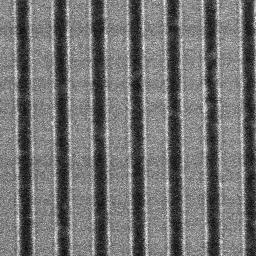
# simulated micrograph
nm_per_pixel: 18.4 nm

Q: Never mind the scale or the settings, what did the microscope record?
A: parallel lines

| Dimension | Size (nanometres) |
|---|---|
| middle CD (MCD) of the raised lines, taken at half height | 302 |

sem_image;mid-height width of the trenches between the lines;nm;385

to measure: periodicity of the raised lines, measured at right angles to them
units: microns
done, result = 0.692